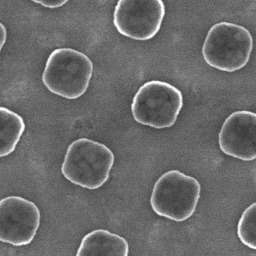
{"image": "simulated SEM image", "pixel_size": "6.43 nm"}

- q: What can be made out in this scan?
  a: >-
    raised bodies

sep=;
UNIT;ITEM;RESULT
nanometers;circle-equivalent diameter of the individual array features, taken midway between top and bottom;314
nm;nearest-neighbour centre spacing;586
